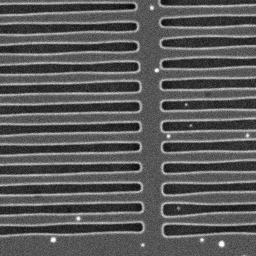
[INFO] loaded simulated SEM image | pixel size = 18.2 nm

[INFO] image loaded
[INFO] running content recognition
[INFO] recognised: groups of lines, slits or small figures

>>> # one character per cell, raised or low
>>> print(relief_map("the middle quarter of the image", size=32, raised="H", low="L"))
LLLLLLLLLLLLLLLLLLLHHHHHLLLLLLLL
LLLLLLLLLLLLLLLLLLLHHHHHHHHHHHHH
HHHHHHHHHHHHHHHHHHHHHHHHHHHHHHHH
HHHHHHHHHHHHHHHHHHHHHHHHHHHHHHHH
HHHHHHHHLLLLLLLLLLLHHHHHLLLLLLLL
LLLLLLLLLLLLLLLLLLLHHHHHLLLLLLLL
LLLLLLLLLLLLLLLLLLLHHHHHHLHHHHHH
HHHHHHHHHHHHHHHHHHHHHHHHHHHHHHHH
HHHHHHHHHHHHHHHHHHHHHHHHHHHHHHHH
HHHHHHHHLLLLLLLLLLHHHHHHHLLLLLLL
LLLLLLLLLLLLLLLLLLLHHHHHLLLLLLLL
LLLLLLLLLLLLLLLLLLLHHHHHHLLLLLLL
HHHHHHHHHHHHHHHHHHHHHHHHHHHHHHHH
HHHHHHHHHHHHHHHHHHHHHHHHHHHHHHHH
HHHHHHHHHHHHHHHHHHHHHHHHHLLLLLLL
LLLLLLLLLLLLLLLLLLLHHHHHLLLLLLLL
LLLLLLLLLLLLLLLLLLLHHHHHHLLLLLLL
HHHHHHHHHHHHHHHHHHHHHHHHHHHHHHHH
HHHHHHHHHHHHHHHHHHHHHHHHHHHHHHHH
HHHHHHHHHHHHHHHHHHHHHHHHHHLLLLLL
LLLLLLLLLLLLLLLLLLLHHHHHHLLLLLLL
LLLLLLLLLLLLLLLLLLLHHHHHHLLLLLLL
HHHHHHHHHHHHHHHHHHHHHHHHHHHHHHHH
HHHHHHHHHHHHHHHHHHHHHHHHHHHHHHHH
HHHHHHHHHHHHHHHHHHHHHHHHHHHHHHHH
LLLLLLLLLLLLLLLLLLLHHHHHHLLLLLLL
LLLLLLLLLLLLLLLLLLLHHHHHHLLLLLLL
LLLHHHHHHHHHHHHHHHHHHHHHHHLLHHHH
HHHHHHHHHHHHHHHHHHHHHHHHHHHHHHHH
HHHHHHHHHHHHHHHHHHHHHHHHHHHHHHHH
LLLLLLLLLLLLLLLLLLLHHHHHHLLLLLLL
LLLLLLLLLLLLLLLLLLLHHHHHHLLLLLLL